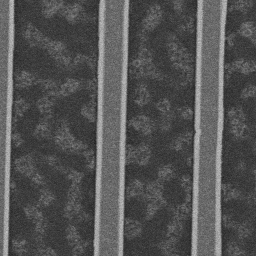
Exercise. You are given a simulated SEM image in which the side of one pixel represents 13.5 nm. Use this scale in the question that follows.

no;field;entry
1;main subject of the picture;one or a few lines or trenches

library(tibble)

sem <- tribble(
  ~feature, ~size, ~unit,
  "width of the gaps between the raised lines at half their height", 82.2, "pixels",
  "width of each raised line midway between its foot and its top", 315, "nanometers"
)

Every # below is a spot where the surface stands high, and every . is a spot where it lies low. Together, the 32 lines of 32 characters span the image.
#............###.........###....
#............###.........###....
#............###.........###....
#............###.........###....
#............###.........###....
#............###.........###....
#............###.........###....
#............###.........###....
#............###.........###....
#............##..........###....
#............##..........###....
#............##..........###....
#............##..........###....
#............##..........###....
#............##..........###....
#............##..........###....
#............##..........##.....
#...........###..........##.....
#...........###..........##.....
#...........###..........##.....
#...........###..........##.....
#...........###..........##.....
#...........###..........##.....
#...........###..........##.....
#...........###.........###.....
#...........###.........###.....
#...........###.........###.....
#...........###.........###.....
#...........###.........###.....
#...........###.........###.....
#...........###.........###.....
#...........###.........###.....